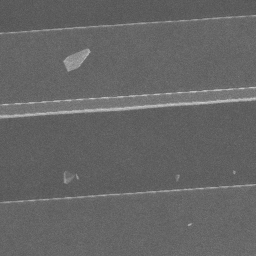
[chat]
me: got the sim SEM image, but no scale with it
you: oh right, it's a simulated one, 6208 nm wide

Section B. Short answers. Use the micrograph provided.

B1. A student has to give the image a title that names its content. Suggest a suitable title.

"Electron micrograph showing lines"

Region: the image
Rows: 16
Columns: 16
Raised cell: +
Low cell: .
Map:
................
........++++++++
++++++++++++++++
++++++++++++++++
++++++++++++++++
++++++++++++++++
++++++++++++....
................
................
................
................
................
...+++++++++++++
++++++++++++++++
++++++++++++++++
++++++++++++++++